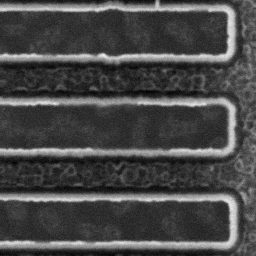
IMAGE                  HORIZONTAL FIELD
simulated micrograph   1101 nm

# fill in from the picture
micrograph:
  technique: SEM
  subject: one or a few lines or trenches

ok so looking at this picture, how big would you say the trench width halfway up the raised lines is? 185 nm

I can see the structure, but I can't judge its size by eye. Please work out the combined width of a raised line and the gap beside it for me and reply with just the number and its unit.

406 nanometres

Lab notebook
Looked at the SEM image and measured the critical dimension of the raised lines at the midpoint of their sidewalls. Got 51.8 px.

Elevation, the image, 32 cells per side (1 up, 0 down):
00000000000000000000000000000000
11111111111111111111111111111000
11111111111111111111111111111000
11111111111111111111111111111000
11111111111111111111111111111000
11111111111111111111111111111000
11111111111111111111111111111000
00000000000001100000000000000000
00000000000000000000000000000000
00000000000000000000000000000000
00000000000000000000000000000000
00000000000000000000000000000000
00000000000000000100000000000000
11111111111111111111111111111000
11111111111111111111111111111000
11111111111111111111111111111000
11111111111111111111111111111000
11111111111111111111111111111000
11111111111111111111111111111000
00000000000000000000000000000000
00000000000000000000000000000000
00000000000000000000000000000000
00000000000000000000000000000000
00000000000000000000000000000000
00000000000000000000000000000000
11111111111111111111111111111000
11111111111111111111111111111000
11111111111111111111111111111000
11111111111111111111111111111000
11111111111111111111111111111000
11111111111111111111111111111000
00000000000000000000000000000000